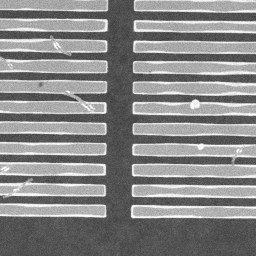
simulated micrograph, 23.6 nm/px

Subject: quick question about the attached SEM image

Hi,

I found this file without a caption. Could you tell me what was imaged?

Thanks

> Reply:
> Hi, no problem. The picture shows groups of lines, slits or small figures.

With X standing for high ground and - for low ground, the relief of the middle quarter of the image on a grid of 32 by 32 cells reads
XXXXXXXXXXX-------XXXXXXXXXXXXXX
XXXXXXXXXXX-------XXXXXXXXXXXXXX
--------------------------------
--------------------------------
XXXXXXXXXX----------------------
XXXXXXXXXX-------XXXXXXXXXXXXXXX
XXXXXXXXXX-------XXXXXXXXXXXXXXX
XXX---------------------------XX
--XX----------------------------
X--XX---------------------------
XXXXXXXXXX--------XXXXXXXXXXXXXX
XXXXXXXXXX--------XXXXXXXXXXXXXX
-----------------------------XXX
--------------------------------
--------------------------------
XXXXXXXXXX-------XXXXXXXXXXXXXXX
XXXXXXXXXX-------XXXXXXXXXXXXXXX
----XXXXXX--------XXXXXXXXXXXXXX
--------------------------------
--------------------------------
XXXXXXXXXX--------XXXXXXXXXXXXXX
XXXXXXXXXX-------XXXXXXXXXXXXXXX
--XXXXXXXX--------XXXXXXXXXXXXXX
--------------------------------
--------------------------------
XXXXXXXXXX-------XXXXXXXXXXXXXXX
XXXXXXXXXX-------XXXXXXXXXXXXXXX
XXXXXXXXXX-------XXXXXXXXXXXXXXX
--------------------------------
--------------------------------
XXXXXXXXXX-------XXXXXXXX-----XX
XXXXXXXXXX-------XXXXXXXXXXXXXXX